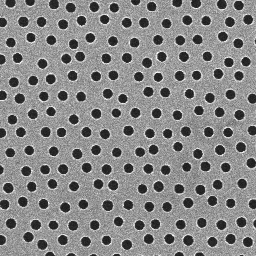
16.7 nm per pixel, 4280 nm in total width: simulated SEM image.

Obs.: a regular array of holes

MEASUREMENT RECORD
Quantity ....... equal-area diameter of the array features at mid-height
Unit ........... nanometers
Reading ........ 170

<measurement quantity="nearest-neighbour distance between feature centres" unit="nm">288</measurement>